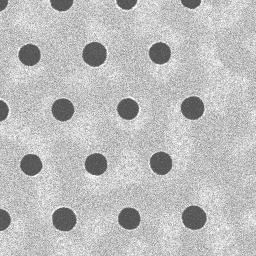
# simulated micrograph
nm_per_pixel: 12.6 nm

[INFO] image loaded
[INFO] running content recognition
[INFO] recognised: a regular array of holes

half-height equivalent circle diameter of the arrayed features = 0.289 microns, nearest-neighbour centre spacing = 0.8 µm